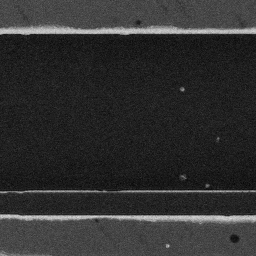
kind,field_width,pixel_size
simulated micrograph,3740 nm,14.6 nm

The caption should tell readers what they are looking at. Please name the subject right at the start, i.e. lines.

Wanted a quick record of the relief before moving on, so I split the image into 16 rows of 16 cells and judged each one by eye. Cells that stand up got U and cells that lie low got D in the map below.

UUUUUUUUUUUUUUUU
UUUUUUUUUUUUUUUU
DDDDDDDDDDDDDDDD
DDDDDDDDDDDDDDDD
DDDDDDDDDDDDDDDD
DDDDDDDDDDDDDDDD
DDDDDDDDDDDDDDDD
DDDDDDDDDDDDDDDD
DDDDDDDDDDDDDDDD
DDDDDDDDDDDDDDDD
DDDDDDDDDDDDDDDD
DDDDDDDDDDDDDDDD
DDDDDDDDDDDDDDDD
UUDDDDDDDDDDDDDD
UUUUUUUUUUUUUUUU
UUUUUUUUUUUUUUUU